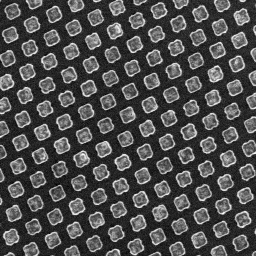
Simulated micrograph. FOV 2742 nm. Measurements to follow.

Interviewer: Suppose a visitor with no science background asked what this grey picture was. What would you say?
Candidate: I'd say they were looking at a regular array of raised bodies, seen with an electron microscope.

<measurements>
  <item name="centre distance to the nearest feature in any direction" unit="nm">252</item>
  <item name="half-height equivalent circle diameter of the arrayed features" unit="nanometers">160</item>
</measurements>